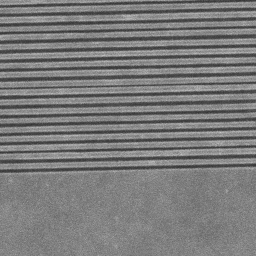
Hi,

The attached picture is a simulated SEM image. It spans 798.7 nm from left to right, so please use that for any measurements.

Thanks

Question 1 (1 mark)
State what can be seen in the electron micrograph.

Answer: parallel lines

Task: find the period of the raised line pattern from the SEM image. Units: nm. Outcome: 28.6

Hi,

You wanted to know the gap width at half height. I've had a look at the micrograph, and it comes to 14 nm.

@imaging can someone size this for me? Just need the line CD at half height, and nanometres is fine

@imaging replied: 17.1